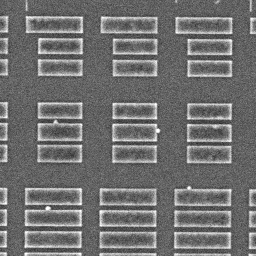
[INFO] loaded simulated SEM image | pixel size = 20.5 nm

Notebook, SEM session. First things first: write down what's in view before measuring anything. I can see wiring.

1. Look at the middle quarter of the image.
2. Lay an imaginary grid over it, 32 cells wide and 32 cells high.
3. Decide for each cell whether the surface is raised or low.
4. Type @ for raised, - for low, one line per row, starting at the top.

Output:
@@@@--------@@@@@@@@@@@--------@
@@@@--------@@@@@@@@@@@--------@
@@@@--------@@@@@@@@@@@--------@
--------------------------------
--------------------------------
--------------------------------
--------------------------------
--------------------------------
--------------------------------
--------------------------------
@@@@--------@@@@@@@@@@@--------@
@@@@--------@@@@@@@@@@@--------@
@@@@--------@@@@@@@@@@@--------@
-@@@--------@@@@@@@@@@@--------@
--------------------------------
@@@@--------@@@@@@@@@@@--------@
@@@@--------@@@@@@@@@@@@-------@
@@@@--------@@@@@@@@@@@--------@
@@@@--------@@@@@@@@@@@--------@
--------------------------------
@@@@----------------------------
@@@@--------@@@@@@@@@@@--------@
@@@@--------@@@@@@@@@@@--------@
@@@@--------@@@@@@@@@@@--------@
--------------------------------
--------------------------------
--------------------------------
--------------------------------
--------------------------------
--------------------------------
--------------------------------
@@@@-----@@@@@@@@@@@@@@-----@@@@